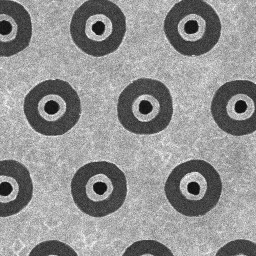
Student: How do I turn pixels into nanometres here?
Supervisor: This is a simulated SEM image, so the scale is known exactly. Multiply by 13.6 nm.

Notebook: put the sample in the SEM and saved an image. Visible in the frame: ring-shaped grooves with a dot in the middle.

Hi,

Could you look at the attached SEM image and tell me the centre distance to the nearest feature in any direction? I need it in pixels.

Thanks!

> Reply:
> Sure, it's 93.